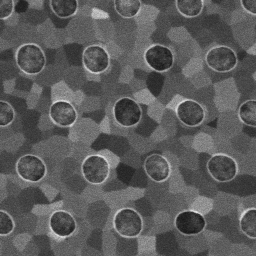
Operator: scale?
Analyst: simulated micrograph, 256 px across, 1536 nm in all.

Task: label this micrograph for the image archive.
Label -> a regular array of holes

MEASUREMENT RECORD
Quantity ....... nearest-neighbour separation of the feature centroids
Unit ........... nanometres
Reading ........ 373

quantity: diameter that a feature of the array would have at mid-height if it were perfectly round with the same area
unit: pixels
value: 26.3